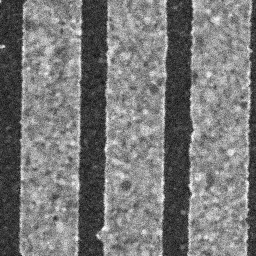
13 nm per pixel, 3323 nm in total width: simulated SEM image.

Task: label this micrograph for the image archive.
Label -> one or a few lines or trenches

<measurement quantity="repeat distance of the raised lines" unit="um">1.1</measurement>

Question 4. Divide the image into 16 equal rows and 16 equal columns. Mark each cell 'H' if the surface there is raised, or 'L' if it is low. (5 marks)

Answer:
LLHHHLLHHHLLHHHH
LHHHHLLHHHLLHHHH
LHHHHLLHHHLLHHHH
LHHHHLLHHHLLHHHH
LHHHHLLHHHLLHHHH
LHHHHLLHHHLLHHHH
LHHHHLLHHHLLHHHH
LHHHHLLHHHLLHHHH
LHHHHLLHHHLLHHHL
LHHHHLLHHHLLHHHH
LHHHHLLHHHLLHHHL
LHHHHLLHHHLLHHHL
LHHHHLLHHHLLHHHL
LHHHHLLHHHLLHHHL
LHHHHLHHHHLLHHHL
LHHHHLLHHHLLHHHL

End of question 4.